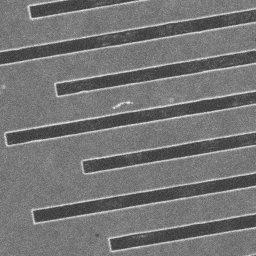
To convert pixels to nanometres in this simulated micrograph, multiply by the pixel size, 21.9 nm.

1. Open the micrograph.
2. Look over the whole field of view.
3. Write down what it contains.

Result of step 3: parallel lines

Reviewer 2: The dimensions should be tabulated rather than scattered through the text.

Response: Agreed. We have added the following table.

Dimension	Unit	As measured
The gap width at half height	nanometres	273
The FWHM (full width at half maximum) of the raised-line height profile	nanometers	613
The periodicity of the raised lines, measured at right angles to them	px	40.5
